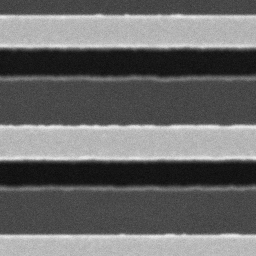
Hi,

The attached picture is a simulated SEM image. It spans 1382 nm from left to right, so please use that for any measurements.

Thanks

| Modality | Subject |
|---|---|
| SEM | lines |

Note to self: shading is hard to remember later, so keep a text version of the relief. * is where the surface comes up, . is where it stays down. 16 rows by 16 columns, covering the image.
****************
****************
****************
................
................
****************
****************
****************
****************
****************
................
................
****************
****************
****************
****************